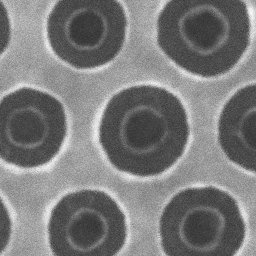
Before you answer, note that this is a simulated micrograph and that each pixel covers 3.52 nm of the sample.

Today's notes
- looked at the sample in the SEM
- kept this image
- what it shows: ring-shaped grooves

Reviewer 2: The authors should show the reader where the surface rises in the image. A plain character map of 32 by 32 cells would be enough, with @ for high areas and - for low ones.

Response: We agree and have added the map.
-@@@@@@--------@@@@@@----------@
-@@@@@----@@----@@@@----@@@----@
-@@@@@---@@@@---@@@@---@@@@@---@
-@@@@@--@@@@@---@@@@---@@@@@@---
-@@@@@--@@@@@---@@@@---@@@@@---@
-@@@@@---@@@----@@@@----@@@@---@
-@@@@@---------@@@@@-----@-----@
@@@@@@@-------@@@@@@@---------@@
@@@@@@@@@----@@@@@@@@@-------@@@
@@@@@@@@@@@@@@@@@@@@@@@@---@@@@@
@@@@@@@@@@@@@@@@@@--@@@@@@@@@@@-
@-----@@@@@@@@@-------@@@@@@@---
--------@@@@@@---------@@@@@----
--------@@@@@----------@@@@@----
-@@@@---@@@@----@@@@----@@@----@
-@@@@@--@@@@---@@@@@@---@@@---@@
-@@@@@--@@@@---@@@@@@---@@@---@@
-@@@@---@@@@---@@@@@----@@@---@@
--------@@@@@---@@@----@@@@@---@
-------@@@@@@----------@@@@@----
@-----@@@@@@@@--------@@@@@@@---
@@@@@@@@@@@@@@@------@@@@@@@@@@-
@@@@@@@@@@@@@@@@@@@@@@@@@@@@@@@@
@@@@@@@@@@@-@@@@@@@@@@@----@@@@@
@@@@@@@@------@@@@@@@--------@@@
-@@@@@@--------@@@@@@---------@@
-@@@@@----@@----@@@@----@@@---@@
-@@@@@---@@@@---@@@@---@@@@@---@
-@@@@@--@@@@@---@@@@---@@@@@---@
-@@@@@---@@@@---@@@@---@@@@@---@
-@@@@@---@@@----@@@@---@@@@----@
@@@@@@---------@@@@@----------@@